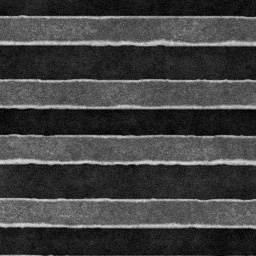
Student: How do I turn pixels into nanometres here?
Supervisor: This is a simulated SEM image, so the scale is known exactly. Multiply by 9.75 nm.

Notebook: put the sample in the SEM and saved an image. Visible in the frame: lines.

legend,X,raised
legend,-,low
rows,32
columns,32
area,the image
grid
--------------------------------
--------------------------------
XXXXXXXXXXXXXXXXXXXXXXXXXXXXXXXX
XXXXXXXXXXXXXXXXXXXXXXXXXXXXXXXX
XXXXXXXXXXXXXXXXXXXXXXXXXXXXXXXX
XXXXXX-XX--XXXXXXXXXXXXXXXXXXXXX
--------------------------------
--------------------------------
--------------------------------
--------------------------------
XXXXXXXXXXXXXXXXXXXXXXXXXXXXXXXX
XXXXXXXXXXXXXXXXXXXXXXXXXXXXXXXX
XXXXXXXXXXXXXXXXXXXXXXXXXXXXXXXX
---------XXXX-X---XX-----XX----X
--------------------------------
--------------------------------
--------------------------------
XXXXXXXXXXXXXXXXXXXXXXXXXXXXXXXX
XXXXXXXXXXXXXXXXXXXXXXXXXXXXXXXX
XXXXXXXXXXXXXXXXXXXXXXXXXXXXXXXX
-----------------------X-------X
--------------------------------
--------------------------------
--------------------------------
--------------------------------
XXXXXXXXXXXXXXXXXXXXXXXXXXXXXXXX
XXXXXXXXXXXXXXXXXXXXXXXXXXXXXXXX
XXXXXXXXXXXXXXXXXXXXXXXXXXXXXXXX
--------------------------------
--------------------------------
--------------------------------
--------------------------------